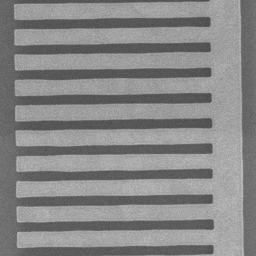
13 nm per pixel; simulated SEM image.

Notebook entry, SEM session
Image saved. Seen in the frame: groups of lines, slits or small figures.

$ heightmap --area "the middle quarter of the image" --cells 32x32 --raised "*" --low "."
********************************
................................
................................
................................
********************************
********************************
********************************
................................
................................
................................
********************************
********************************
********************************
********************************
................................
................................
.....................***********
********************************
********************************
********************************
................................
................................
................................
********************************
********************************
********************************
*********.......................
................................
................................
********************************
********************************
********************************